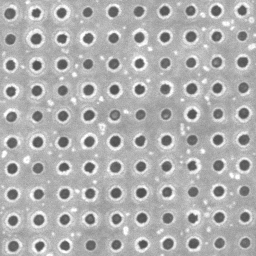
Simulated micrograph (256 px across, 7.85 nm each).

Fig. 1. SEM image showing a regular array of holes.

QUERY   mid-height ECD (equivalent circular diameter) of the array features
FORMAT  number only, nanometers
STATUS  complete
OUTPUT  87.3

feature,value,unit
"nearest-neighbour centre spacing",25.5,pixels